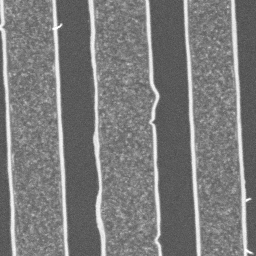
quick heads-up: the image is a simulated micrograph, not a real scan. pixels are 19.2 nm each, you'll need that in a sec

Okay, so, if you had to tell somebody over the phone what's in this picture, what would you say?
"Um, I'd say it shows one or a few lines or trenches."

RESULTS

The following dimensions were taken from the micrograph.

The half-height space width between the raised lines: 36.8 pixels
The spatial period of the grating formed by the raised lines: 1740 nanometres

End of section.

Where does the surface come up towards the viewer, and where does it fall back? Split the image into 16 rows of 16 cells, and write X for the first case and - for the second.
XXX---XXX---XXX-
XXX---XXX---XXX-
XXXX--XXX---XXX-
XXXX--XXX---XXX-
XXXX--XXX---XXX-
XXXX--XXXX--XXX-
XXXX--XXXX--XXX-
XXXX--XXXX--XXX-
-XXX--XXXX--XXX-
-XXX--XXXX--XXX-
-XXX--XXXX--XXX-
-XXX--XXXX--XXX-
-XXX--XXXX--XXX-
-XXX--XXXX--XXX-
-XXX--XXXX--XXX-
-XXX--XXXX--XXX-